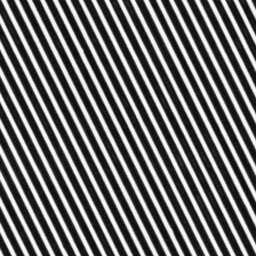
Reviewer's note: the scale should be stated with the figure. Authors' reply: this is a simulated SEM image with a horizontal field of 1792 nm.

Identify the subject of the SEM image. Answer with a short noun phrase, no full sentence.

parallel lines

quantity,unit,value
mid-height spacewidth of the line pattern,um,0.0502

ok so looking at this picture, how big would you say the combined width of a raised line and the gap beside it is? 0.0809 um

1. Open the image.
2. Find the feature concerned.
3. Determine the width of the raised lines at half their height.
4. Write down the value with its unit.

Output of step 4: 0.0306 µm